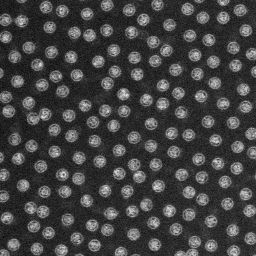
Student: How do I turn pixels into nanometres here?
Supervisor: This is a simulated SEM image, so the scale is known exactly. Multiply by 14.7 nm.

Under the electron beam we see a regular array of raised bodies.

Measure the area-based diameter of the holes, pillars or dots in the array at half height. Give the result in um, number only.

0.154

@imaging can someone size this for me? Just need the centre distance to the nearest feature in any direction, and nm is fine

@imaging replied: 268